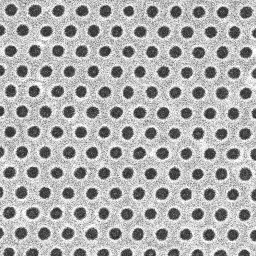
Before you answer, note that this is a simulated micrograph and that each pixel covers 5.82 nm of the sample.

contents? a regular array of holes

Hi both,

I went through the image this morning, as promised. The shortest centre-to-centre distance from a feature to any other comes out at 134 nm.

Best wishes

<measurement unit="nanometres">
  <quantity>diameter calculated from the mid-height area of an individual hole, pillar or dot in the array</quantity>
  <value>69.9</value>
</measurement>